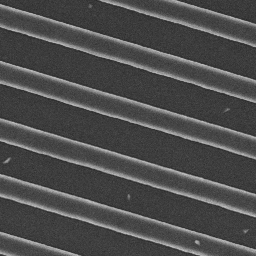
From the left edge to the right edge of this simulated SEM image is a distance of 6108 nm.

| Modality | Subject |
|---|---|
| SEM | lines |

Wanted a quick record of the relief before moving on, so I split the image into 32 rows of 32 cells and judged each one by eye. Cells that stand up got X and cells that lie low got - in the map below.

--------------XXXXXXXXX---------
XXX--------------XXXXXXXXXX-----
XXXXXXX--------------XXXXXXXXX--
-XXXXXXXXX--------------XXXXXXXX
----XXXXXXXXX--------------XXXXX
--------XXXXXXXXX--------------X
-----------XXXXXXXXX------------
--------------XXXXXXXXX---------
XXX--------------XXXXXXXXXX-----
XXXXXX---------------XXXXXXXXX--
XXXXXXXXXX--------------XXXXXXXX
----XXXXXXXXX--------------XXXXX
-------XXXXXXXXX---------------X
----------XXXXXXXXX-------------
--------------XXXXXXXXX---------
XX---------------XXXXXXXXX------
XXXXX----------------XXXXXXXXX--
XXXXXXXXX---------------XXXXXXXX
---XXXXXXXXX---------------XXXXX
------XXXXXXXXX----------------X
----------XXXXXXXXX-------------
-------------XXXXXXXXX----------
XXX--------------XXXXXXXXX------
XXXXXX--------------XXXXXXXXX---
XXXXXXXXX---------------XXXXXXXX
----XXXXXXXXX--------------XXXXX
-------XXXXXXXXX--------------XX
----------XXXXXXXXXX------------
--------------XXXXXXXXX---------
XX---------------XXXXXXXXX------
XXXXX---------------XXXXXXXXX---
XXXXXXXXX---------------XXXXXXXX